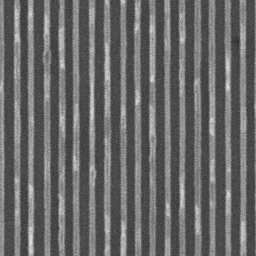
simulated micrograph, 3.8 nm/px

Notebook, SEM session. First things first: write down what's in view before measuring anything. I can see parallel lines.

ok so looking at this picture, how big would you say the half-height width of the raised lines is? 19 nanometres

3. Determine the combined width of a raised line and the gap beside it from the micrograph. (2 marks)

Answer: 57.1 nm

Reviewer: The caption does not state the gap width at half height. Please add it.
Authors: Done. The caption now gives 0.038 micrometres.